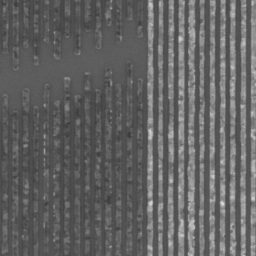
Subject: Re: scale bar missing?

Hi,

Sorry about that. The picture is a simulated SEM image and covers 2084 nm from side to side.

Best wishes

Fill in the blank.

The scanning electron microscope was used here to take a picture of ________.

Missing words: parallel lines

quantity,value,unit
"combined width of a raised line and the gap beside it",84.3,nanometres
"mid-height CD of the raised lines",39.7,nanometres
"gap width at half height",0.0478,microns